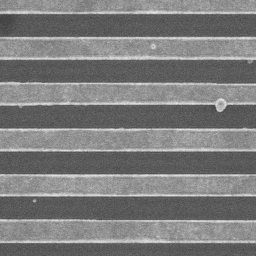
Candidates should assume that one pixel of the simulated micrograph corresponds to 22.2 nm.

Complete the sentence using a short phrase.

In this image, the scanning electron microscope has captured lines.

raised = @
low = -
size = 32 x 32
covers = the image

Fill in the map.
@@@@@@@@@@@@@@@@@@@@@@@@@@@@@@@@
@@@@@@@@@@@@@@@@@@@@@@@@@@@@@@@@
--------------------------------
--------------------------------
--------------------------------
@@@@@@@@@@@@@@@@@@@@@@@@@@@@@@@@
@@@@@@@@@@@@@@@@@@@@@@@@@@@@@@@@
--------------------------------
--------------------------------
--------------------------------
@@@@@@@@@@@@@@@@@@@@@@@@@-------
@@@@@@@@@@@@@@@@@@@@@@@@@@@@@@@@
@@@@@@@@@@@@@@@@@@@@@@@@@@@@@@@@
---------------------------@----
--------------------------------
--------------------------------
@@@@@@@@@@@@@@@@@@@@@@@@@@@@@@@@
@@@@@@@@@@@@@@@@@@@@@@@@@@@@@@@@
@@@@@@@@@@@@@@@@@@@@@@@@@@@@@@@@
--------------------------------
--------------------------------
--------------------------------
@@@@@@@@@@@@@@@@@@@@@@@@@@@@@@@@
@@@@@@@@@@@@@@@@@@@@@@@@@@@@@@@@
--------------------------------
--------------------------------
--------------------------------
--------------------------------
@@@@@@@@@@@@@@@@@@@@@@@@@@@@@@@@
@@@@@@@@@@@@@@@@@@@@@@@@@@@@@@@@
--------------------------------
--------------------------------